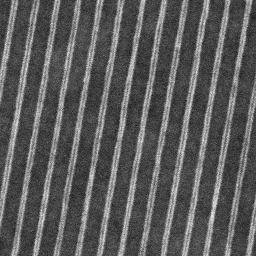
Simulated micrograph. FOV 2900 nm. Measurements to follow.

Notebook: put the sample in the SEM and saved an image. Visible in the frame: parallel lines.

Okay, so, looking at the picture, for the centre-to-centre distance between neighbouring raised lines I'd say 237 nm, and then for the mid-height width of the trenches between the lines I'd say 197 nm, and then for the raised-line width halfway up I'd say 41.9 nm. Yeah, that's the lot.